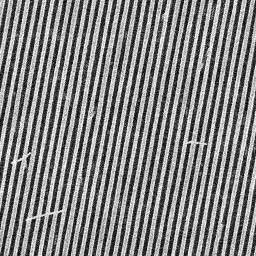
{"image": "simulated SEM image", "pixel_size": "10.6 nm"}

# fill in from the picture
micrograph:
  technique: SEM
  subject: parallel lines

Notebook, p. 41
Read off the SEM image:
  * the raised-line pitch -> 87.1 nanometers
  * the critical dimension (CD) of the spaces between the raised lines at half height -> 47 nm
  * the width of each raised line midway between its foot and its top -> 37.8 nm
